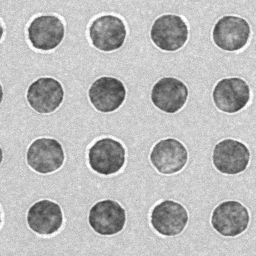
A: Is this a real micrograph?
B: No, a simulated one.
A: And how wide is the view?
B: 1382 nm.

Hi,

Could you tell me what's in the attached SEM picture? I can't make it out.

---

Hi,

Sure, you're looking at a regular array of holes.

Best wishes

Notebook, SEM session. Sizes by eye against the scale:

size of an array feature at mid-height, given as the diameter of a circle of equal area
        0.202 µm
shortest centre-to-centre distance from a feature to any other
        61.1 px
